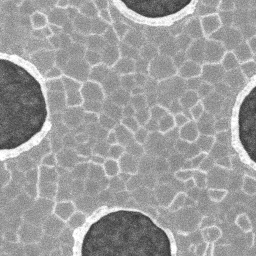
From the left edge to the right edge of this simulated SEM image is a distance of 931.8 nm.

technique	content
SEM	holes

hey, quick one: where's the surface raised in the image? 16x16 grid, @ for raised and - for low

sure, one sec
@@@@@@@@---@@@@@
@@@@@@@@@@@@@@@@
@@@@@@@@@@@@@@@@
@@@@@@@@@@@@@@@@
--@@@@@@@@@@@@@@
---@@@@@@@@@@@@@
---@@@@@@@@@@@@-
---@@@@@@@@@@@@-
--@@@@@@@@@@@@@-
@@@@@@@@@@@@@@@-
@@@@@@@@@@@@@@@@
@@@@@@@@@@@@@@@@
@@@@@@@@@@@@@@@@
@@@@@@---@@@@@@@
@@@@@-----@@@@@@
@@@@@------@@@@@